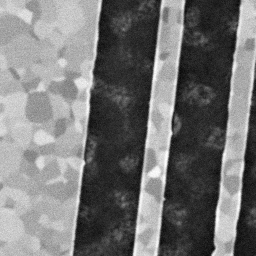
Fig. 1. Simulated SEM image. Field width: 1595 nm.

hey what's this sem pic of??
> one or a few lines or trenches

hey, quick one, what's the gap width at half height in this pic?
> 364 nanometers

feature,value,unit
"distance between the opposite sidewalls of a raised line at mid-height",137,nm